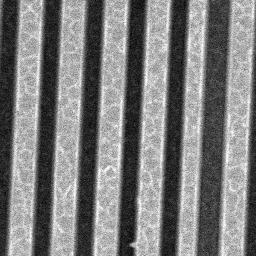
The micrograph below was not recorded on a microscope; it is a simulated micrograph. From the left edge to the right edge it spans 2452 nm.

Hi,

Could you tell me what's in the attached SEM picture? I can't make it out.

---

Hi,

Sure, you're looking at parallel lines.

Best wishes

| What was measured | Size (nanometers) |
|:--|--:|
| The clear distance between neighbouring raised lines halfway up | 163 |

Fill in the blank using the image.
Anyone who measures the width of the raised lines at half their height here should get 0.243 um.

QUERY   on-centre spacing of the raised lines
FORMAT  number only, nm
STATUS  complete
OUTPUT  405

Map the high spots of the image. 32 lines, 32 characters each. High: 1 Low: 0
00111100111001110011100011000111
00111000111001110011100111000111
00111000111001110011100111000111
00111000111001110011100111000111
00111000111001110011100111000111
00111001111001110011100111000111
00111001111001110011100111000111
00111001111001110011100111000111
00111001110001110011100111000111
00111001110001110011100110000111
00111001110001110011100110001111
00111001110001110011100110001111
00111001110011110011100110001110
00111001110011110011100110001110
00111001110011100011100110001110
00111001110011100011100110001110
00111001110011100011100110001110
00111001110011100011100110001110
00111001110011100111100110001110
00111001110011100111100110001110
00111001110011100111000110001110
01111001110011100111000110001110
01111001110011100111000110001110
01110001110011100111000110001110
01110001110011100111000110001110
01110001110011100111001110001110
01110001110011100111001110001110
01110011110011100111001110001110
01110011110011100111001110001110
01110011100011100111001110001110
01110011100011100111001110001110
01110011100011100111001100011110